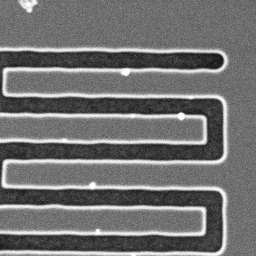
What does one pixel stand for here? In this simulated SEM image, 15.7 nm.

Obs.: groups of lines, slits or small figures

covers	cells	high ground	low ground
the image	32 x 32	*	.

********************************
********************************
********************************
********************************
********************************
********************************
...........................*****
............................****
............................****
.*******************************
.*******************************
.*******************************
............................****
............................****
******************....**....****
**************************..****
**************************..****
**************************..****
............................****
............................****
.*******************************
********************************
********************************
......**...*..******************
............................****
............................****
**************************..****
**************************..****
**************************..****
............................****
............................****
...........................*****